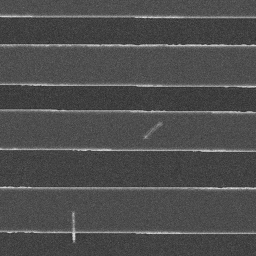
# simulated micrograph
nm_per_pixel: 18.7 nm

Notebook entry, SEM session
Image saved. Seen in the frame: lines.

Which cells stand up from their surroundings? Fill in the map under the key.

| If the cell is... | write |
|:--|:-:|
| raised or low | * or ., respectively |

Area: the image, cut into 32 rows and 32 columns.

********************************
********************************
................................
................................
................................
................................
********************************
********************************
********************************
********************************
********************************
................................
................................
................................
********************************
********************************
********************************
********************************
********************************
................................
................................
................................
................................
****............................
********************************
********************************
********************************
********************************
********************************
................................
................................
................................